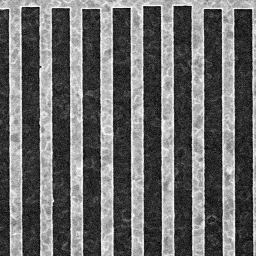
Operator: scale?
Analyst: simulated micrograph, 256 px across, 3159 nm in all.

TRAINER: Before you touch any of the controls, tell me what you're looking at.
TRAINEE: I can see parallel lines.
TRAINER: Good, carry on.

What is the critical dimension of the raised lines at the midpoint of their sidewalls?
0.139 microns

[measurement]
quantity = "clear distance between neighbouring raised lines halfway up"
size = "18.9 pixels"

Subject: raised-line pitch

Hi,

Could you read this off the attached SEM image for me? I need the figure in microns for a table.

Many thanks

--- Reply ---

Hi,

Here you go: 0.375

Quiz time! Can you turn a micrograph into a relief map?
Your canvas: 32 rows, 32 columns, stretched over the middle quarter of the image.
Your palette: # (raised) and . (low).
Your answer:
..##.....###.....###.....##.....
..##.....###.....###.....##.....
..##.....###.....###.....##.....
..##.....###.....###.....##.....
..##.....###.....###.....##.....
..##.....###.....###.....##.....
..##.....###.....###.....##.....
..##.....###.....###.....##.....
..##.....###.....###....###.....
..##.....###.....###.....##.....
..##.....###.....###.....##.....
..##.....###.....###.....##.....
..##.....###.....###.....##.....
..##.....###.....###.....##.....
..###....###.....###.....##.....
..##.....###.....###.....##.....
..###....###.....###.....##.....
..###....###.....###.....##.....
..##.....###.....###.....##.....
..###....###.....###.....##.....
..##.....###.....###.....##.....
..##.....###.....###.....##.....
..###....###.....###.....##.....
..###....###.....###.....##.....
..##.....###.....###.....##.....
..##.....###.....###.....##.....
..##.....###.....###.....##.....
..###....###.....###.....##.....
..###....###.....###.....##.....
..##.....###.....###.....##.....
..##.....###.....###.....##.....
..##......##.....###.....##.....